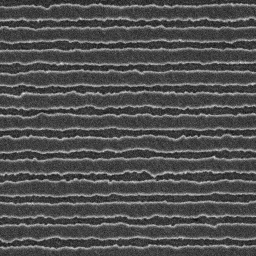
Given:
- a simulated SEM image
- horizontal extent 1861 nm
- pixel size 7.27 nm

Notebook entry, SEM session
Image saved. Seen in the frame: parallel lines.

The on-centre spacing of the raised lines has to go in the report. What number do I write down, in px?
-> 21.9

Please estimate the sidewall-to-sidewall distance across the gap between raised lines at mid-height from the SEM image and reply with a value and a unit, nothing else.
50.9 nanometers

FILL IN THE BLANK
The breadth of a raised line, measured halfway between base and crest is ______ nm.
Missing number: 107